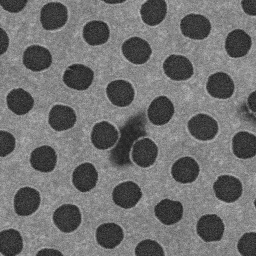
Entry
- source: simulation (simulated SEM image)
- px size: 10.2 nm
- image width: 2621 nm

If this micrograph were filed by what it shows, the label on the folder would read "a regular array of holes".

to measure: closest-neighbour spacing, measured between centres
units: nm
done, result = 455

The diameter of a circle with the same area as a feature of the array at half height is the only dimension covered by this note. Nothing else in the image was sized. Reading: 28.8 pixels